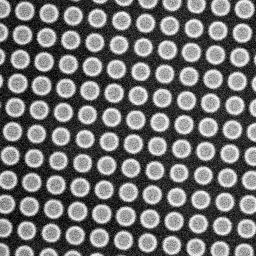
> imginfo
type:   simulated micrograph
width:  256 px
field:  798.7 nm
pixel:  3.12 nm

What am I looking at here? an array of small figures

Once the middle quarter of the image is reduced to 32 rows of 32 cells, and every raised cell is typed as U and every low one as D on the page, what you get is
UUUDDUUUUDDUUUUDDDUUUDDDUDDDDDDD
UUUDDUUUUDDUUUUDDUUUUDDUUUUDDDUU
DDDDDDUUUDDUUUUDDUUUUDDUUUUDDUUU
DDDDDDDDDDDDDDDDDDUUUDDUUUUDDUUU
UUDDDDDDDDDDDDDDDDDDDDDDDUDDDDUU
UUUDDUUUDDDUUUDDDDDDDDDDDDDDDDDD
UUUDUUUUUDUUUUUDDUUUDDDDUUDDDDDD
UUDDUUUUDDUUUUUDUUUUUDDUUUUDDUUU
DDDDDUUUDDDUUUDDUUUUUDDUUUUDDUUU
DDDDDDDDDDDDDDDDDUUUDDDUUUDDUUUU
UDDDDDDDDDDDDDDDDDDDDDDDUDDDDUUU
UUDDUUUUDDDUUDDDDDDDDDDDDDDDDDDD
UUDDUUUUDDUUUUDDUUUUDDDUDDDDDDDD
UDDDUUUUDDUUUUDDUUUUDDUUUUDDDUUD
DDDDDUUDDDUUUUDDUUUUDDUUUUDDUUUU
DDDDDDDDDDDDDDDDUUUUDDUUUUDDUUUU
UDDDDDDDDDDDDDDDDDDDDDDUUDDDUUUU
UDDDUUUDDDUUDDDDDDDDDDDDDDDDDDDD
UDDUUUUDDUUUUDDDUUUDDDDDDDDDDDDD
UDDUUUUDDUUUUDDUUUUDDUUUUDDDUUUD
DDDDUUDDDUUUUDDUUUUDDUUUUDDUUUUD
DDDDDDDDDDUUDDDDUUUDDUUUUDDUUUUD
DDDDDDDDDDDDDDDDDDDDDDUUDDDDUUUD
UDDUUUDDDDUUDDDDDDDDDDDDDDDDDDDD
UDDUUUUDDUUUUDDUUUDDDDDDDDDDDDDD
DDDUUUUDDUUUUDDUUUUDDUUUDDDDUUDD
DDDUUUDDDUUUDDDUUUUDDUUUUDDUUUUD
DDDDDDDDDDDDDDDUUUDDDUUUUDDUUUUD
DDDDDDDDDDDDDDDDDDDDDDUUDDDUUUDD
DDUUUUDDDUUDDDDDDDDDDDDDDDDDDDDD
DDUUUUDDUUUUDDDUUUDDDDDDDDDDDDDD
DDUUUUDDUUUUDDUUUUDDUUUUDDDUUDDD